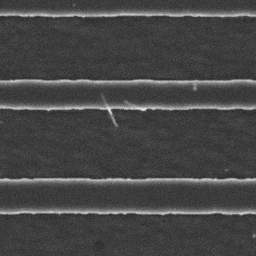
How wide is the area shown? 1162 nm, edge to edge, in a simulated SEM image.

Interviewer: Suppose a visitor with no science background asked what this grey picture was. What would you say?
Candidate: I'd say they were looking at lines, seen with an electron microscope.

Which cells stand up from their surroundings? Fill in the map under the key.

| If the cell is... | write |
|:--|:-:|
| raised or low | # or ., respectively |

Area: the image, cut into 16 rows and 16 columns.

################
................
................
................
................
################
################
................
................
................
................
################
################
................
................
................